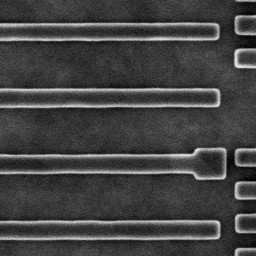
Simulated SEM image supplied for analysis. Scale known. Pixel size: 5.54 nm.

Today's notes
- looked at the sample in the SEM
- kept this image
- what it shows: wiring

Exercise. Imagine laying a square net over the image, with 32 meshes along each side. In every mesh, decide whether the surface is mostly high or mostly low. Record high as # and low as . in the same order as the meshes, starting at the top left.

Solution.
................................
................................
.............................###
###########################..###
###########################.....
................................
..............................##
.............................###
................................
................................
................................
###########################.....
###########################.....
................................
................................
................................
................................
................................
................................
############################.###
############################..##
############################....
................................
.............................###
..............................##
................................
................................
.............................###
###########################..###
###########################.....
................................
.............................###